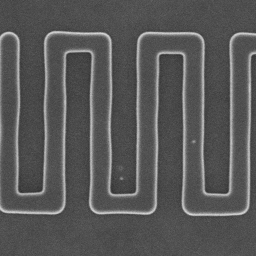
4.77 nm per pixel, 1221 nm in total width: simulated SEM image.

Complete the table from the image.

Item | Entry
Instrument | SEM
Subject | groups of lines, slits or small figures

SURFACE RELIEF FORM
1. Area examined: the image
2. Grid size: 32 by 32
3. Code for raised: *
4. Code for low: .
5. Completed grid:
................................
................................
................................
................................
**....*******.....*******....***
**....********...********....***
**....***..***...********....***
**....**...***...***...**....**.
**....**...***...***...**....**.
**....**...***...***...**....**.
**....**...***...***...**....**.
**....**...***...***...**....**.
**....**...***...***...**....**.
**....**...***...***...**....**.
**....**...***...***...**....**.
**....**...***...***...**....**.
**....**...***...***...**....**.
**....**...***...***...**....**.
**....**...***...***...**....**.
**....**...***...***...**....**.
**....**...***...***...**....**.
**....**...***...***...**....**.
**...***...***...**....**....**.
**...***...***...**....***...**.
********...********....********.
********...********....********.
.******.....*******....********.
................................
................................
................................
................................
................................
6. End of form